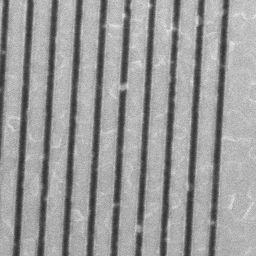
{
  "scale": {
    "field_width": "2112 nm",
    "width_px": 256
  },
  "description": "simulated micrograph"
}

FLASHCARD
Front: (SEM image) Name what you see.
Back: parallel lines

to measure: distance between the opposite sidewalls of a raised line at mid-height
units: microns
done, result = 0.0741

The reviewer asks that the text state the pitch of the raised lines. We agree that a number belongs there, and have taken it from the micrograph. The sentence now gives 200 nm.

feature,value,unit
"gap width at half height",126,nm